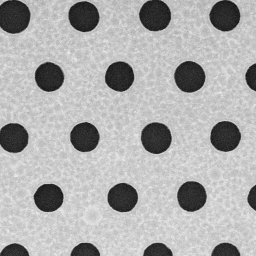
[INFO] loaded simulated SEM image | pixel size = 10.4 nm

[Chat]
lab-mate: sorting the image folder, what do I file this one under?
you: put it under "a regular array of holes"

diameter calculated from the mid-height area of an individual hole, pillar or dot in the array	314	nm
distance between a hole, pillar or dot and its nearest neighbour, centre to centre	717	nanometres